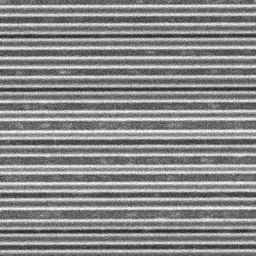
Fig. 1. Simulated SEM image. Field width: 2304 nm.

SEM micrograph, parallel lines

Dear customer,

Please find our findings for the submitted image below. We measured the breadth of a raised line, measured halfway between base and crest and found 85.5 nanometers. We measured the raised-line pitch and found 158 nm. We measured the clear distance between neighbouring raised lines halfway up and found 77.6 nanometers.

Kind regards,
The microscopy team